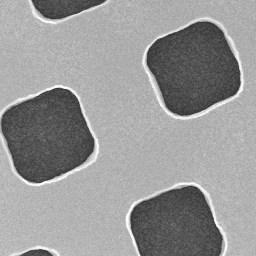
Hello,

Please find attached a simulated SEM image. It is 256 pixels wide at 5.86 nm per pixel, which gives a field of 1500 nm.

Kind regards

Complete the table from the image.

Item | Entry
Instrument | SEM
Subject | holes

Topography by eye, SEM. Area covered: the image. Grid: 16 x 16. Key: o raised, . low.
oo....oooooooooo
oooooooooooo.ooo
oooooooooo....oo
ooooooooo......o
ooooooooo......o
oooooooooo.....o
o....ooooo...ooo
.....ooooooooooo
......oooooooooo
o.....oooooooooo
o....ooooooooooo
oooooooooooooooo
ooooooooo....ooo
oooooooo.....ooo
oooooooo......oo
ooooooooo.....oo